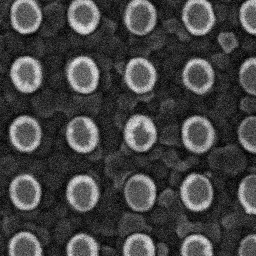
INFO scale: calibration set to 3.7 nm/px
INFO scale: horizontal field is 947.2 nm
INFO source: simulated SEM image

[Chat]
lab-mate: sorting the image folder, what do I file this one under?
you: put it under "a regular array of raised bodies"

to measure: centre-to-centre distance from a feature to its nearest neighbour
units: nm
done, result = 211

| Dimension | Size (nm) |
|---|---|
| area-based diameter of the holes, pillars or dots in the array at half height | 121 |